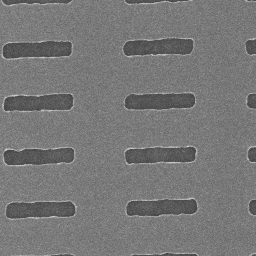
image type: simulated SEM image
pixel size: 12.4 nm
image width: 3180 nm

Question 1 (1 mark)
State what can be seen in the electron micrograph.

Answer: a regular array of holes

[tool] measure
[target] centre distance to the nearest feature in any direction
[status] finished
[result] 659 nanometres